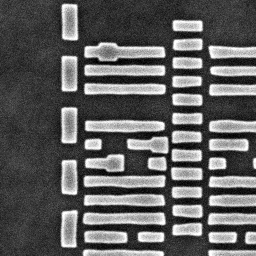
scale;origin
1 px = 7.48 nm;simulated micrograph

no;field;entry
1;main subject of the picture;wiring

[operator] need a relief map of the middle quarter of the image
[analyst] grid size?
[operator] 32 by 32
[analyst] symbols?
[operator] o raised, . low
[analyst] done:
ooo...oooooo....ooo........ooooo
ooo..oooooooooooooooooooo.......
ooo..oooooooooooooooooooo.......
ooo........................ooooo
ooo........................ooooo
ooo..oooooooooooooooooooo..ooooo
ooo..oooooooooooooooooooo.......
................................
...........................ooooo
...........................ooooo
................................
ooo.............................
ooo........................oo...
ooo........................ooooo
ooo...oooooooooooooooooo...ooooo
ooo...ooooooooooooooooooo.......
ooo...oooooooooooooooooo........
ooo........................ooooo
ooo...................oooo.ooooo
ooo..oooo.......oooooooooo.ooo..
.....oooo.......oooooooooo......
......................oooo.o....
...........................ooooo
...........oooo.........o..ooooo
ooo...ooooooooo......oooo.......
ooo...ooooooooo......oooo.......
ooo........oooo............ooooo
ooo........................ooooo
ooo..oooooooooooooooooooo..ooooo
ooo..oooooooooooooooooooo.......
ooo...........oooooo.ooo........
ooo........................ooooo